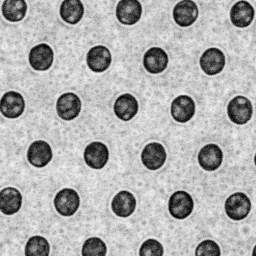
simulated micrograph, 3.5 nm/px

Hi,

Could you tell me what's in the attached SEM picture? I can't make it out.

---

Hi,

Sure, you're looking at a regular array of holes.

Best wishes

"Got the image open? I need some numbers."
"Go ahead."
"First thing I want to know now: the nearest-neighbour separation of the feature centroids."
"194 nm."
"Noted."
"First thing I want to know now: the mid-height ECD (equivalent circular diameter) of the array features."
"97.6 nm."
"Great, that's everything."